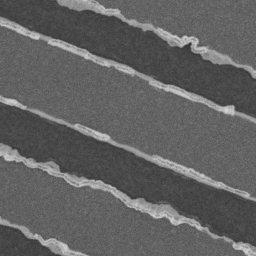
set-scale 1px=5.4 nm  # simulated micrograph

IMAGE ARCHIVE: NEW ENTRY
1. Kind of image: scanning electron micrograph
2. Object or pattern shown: one or a few lines or trenches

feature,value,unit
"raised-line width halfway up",408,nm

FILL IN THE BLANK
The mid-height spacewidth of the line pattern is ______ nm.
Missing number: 238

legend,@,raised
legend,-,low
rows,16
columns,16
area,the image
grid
------@@@@@@@@@@
@-------@@@@@@@@
@@@@-------@@@@@
@@@@@@-------@@@
@@@@@@@@@-------
@@@@@@@@@@@-----
@@@@@@@@@@@@@---
---@@@@@@@@@@@@@
------@@@@@@@@@@
--------@@@@@@@@
@@@--------@@@@@
@@@@@@@------@@@
@@@@@@@@--------
@@@@@@@@@@@-----
-@@@@@@@@@@@@---
---@@@@@@@@@@@@@